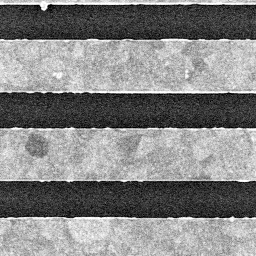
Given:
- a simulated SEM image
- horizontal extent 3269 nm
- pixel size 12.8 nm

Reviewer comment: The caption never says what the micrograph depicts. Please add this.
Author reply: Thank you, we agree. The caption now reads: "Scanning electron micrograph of lines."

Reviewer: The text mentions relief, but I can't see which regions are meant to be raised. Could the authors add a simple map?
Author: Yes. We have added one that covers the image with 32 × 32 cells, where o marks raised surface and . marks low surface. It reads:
.....o..........................
................................
................................
................................
................................
oooooooooooooooooooooooooooooooo
oooooooooooooooooooooooooooooooo
oooooooooooooooooooooooooooooooo
oooooooooooooooooooooooooooooooo
oooooooooooooooooooooooooooooooo
oooooooooooooooooooooooooooooooo
.....o......ooooo.oooooooooooooo
................................
................................
................................
................................
oooooooooooooooooooooooooooooooo
oooooooooooooooooooooooooooooooo
oooooooooooooooooooooooooooooooo
oooooooooooooooooooooooooooooooo
oooooooooooooooooooooooooooooooo
oooooooooooooooooooooooooooooooo
oooooooooooooooooooooooooooooooo
................................
................................
................................
................................
oooooooooooooooooooooooooooooooo
oooooooooooooooooooooooooooooooo
oooooooooooooooooooooooooooooooo
oooooooooooooooooooooooooooooooo
oooooooooooooooooooooooooooooooo